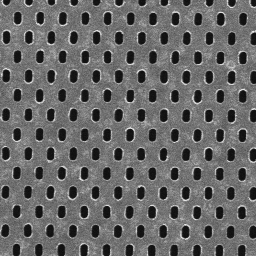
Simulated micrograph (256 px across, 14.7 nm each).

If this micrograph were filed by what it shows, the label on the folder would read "a regular array of holes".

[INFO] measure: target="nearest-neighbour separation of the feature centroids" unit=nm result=324